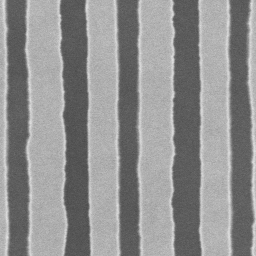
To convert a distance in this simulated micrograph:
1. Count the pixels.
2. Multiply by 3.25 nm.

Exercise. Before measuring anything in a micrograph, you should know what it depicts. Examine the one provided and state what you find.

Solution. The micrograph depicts lines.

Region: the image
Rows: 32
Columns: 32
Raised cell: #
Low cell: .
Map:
#..####....###...#####...####..#
#..####....####..#####...####..#
#..#####...####..####....####..#
#..#####...####..#####...####..#
#..#####...####..#####...####..#
#..####....####..#####...###...#
#..#####...####..#####...###...#
#..#####...####..#####...####..#
#..#####...####..#####...####..#
#...####...####..#####...####..#
#...####...####..#####...####..#
#...####...####..#####...####..#
#...####...####..#####...####..#
#...####...####..#####...####..#
#...####...####..#####...####..#
#...####...####..#####...####..#
#...####...####..#####...####..#
#...####...####..#####...####...
#..#####...####..#####...####...
#..#####...####..#####...####...
#...####...####..#####...####...
#...####...####..####....####...
#...####...####..####....####...
#...####...####..#####...####..#
#...####...####..####....####...
#...####...####..####....####...
#...####...####...###....####...
#...####...####..#####...####...
#...####...####..#####...####...
#...####...####...####...####...
#...####...####...####...####...
#...####...####...####...####..#